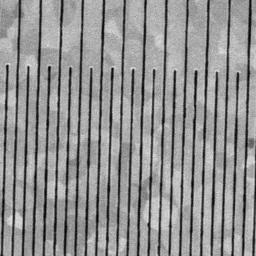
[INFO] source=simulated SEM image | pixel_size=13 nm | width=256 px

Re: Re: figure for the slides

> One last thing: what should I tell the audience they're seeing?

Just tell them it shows parallel lines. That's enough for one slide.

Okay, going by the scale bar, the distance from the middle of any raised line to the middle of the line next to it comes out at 137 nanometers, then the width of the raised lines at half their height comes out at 104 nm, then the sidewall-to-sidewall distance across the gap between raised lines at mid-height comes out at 34.2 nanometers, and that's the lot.